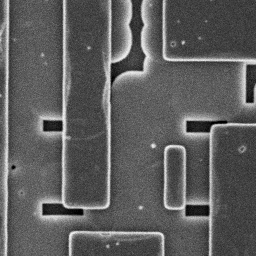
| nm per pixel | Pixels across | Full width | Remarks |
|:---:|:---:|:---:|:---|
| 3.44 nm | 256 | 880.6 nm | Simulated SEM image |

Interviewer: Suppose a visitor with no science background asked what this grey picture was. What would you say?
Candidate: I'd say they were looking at wiring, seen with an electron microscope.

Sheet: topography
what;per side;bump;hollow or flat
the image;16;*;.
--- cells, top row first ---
*...***...******
*...***...******
*...***...******
....***...******
....***.........
....***.........
....***.........
....***.........
....***......***
....***...*..***
....***...**.***
....***...**.***
....***...**.***
.............***
.............***
....******...***